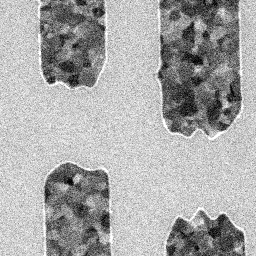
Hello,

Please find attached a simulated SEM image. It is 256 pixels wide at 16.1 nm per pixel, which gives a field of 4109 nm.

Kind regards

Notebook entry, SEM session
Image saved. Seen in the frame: one or a few lines or trenches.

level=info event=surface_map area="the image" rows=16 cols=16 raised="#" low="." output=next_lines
..#####...#####.
..#####...#####.
..#####...#####.
...####...#####.
...###....#####.
....#.....#####.
..........#####.
..........#####.
................
................
...##...........
...####.........
...####.........
...####.....#...
...####....####.
...####...#####.